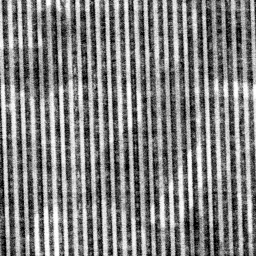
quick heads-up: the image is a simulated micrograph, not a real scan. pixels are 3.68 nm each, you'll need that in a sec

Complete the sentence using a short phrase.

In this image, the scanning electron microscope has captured parallel lines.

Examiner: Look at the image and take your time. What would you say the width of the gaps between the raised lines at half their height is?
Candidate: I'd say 23.9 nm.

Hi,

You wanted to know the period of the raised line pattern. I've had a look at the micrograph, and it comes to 35.7 nm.